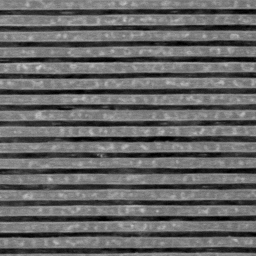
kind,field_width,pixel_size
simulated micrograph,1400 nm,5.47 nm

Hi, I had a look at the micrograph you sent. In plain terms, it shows parallel lines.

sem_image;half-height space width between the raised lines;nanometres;32.8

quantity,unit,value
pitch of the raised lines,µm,0.0869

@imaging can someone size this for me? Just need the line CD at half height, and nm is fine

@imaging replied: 54.7